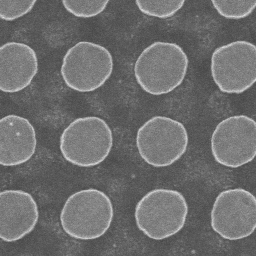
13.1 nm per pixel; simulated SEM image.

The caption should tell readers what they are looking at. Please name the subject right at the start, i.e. raised bodies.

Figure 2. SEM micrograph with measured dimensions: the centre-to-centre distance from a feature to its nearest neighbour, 72.9 px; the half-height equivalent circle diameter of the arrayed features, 656 nm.